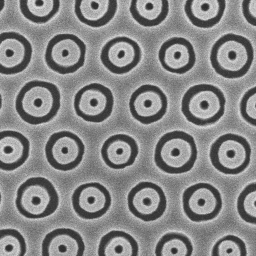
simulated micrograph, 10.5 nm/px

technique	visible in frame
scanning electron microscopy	a regular array of ring-shaped grooves with a dot in the middle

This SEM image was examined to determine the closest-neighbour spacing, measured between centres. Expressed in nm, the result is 566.